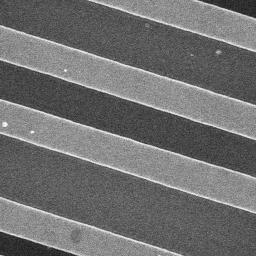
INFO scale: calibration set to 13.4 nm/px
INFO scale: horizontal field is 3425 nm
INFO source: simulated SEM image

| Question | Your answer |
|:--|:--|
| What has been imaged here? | lines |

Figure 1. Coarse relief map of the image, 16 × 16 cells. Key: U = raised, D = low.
DDDDDDDUUUUUUUDD
DDDDDDDDDDUUUUUU
UUUDDDDDDDDDDDUU
UUUUUUDDDDDDDDDD
DDDUUUUUUDDDDDDD
DDDDDDUUUUUUDDDD
UDDDDDDDDUUUUUUU
UUUUDDDDDDDDUUUU
DUUUUUUDDDDDDDDU
DDDDUUUUUUUDDDDD
DDDDDDDUUUUUUUDD
DDDDDDDDDDUUUUUU
DDDDDDDDDDDDDUUU
UUUUDDDDDDDDDDDD
UUUUUUUDDDDDDDDD
DDDUUUUUUUDDDDDD